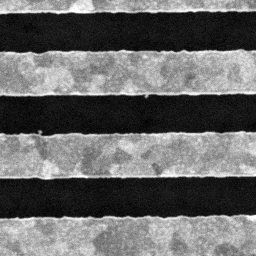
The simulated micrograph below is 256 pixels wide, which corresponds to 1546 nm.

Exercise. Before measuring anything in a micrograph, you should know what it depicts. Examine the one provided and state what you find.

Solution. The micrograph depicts lines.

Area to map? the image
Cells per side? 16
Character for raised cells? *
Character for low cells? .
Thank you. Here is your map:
****************
................
................
****************
****************
****************
................
................
****************
****************
****************
................
................
.............***
****************
****************